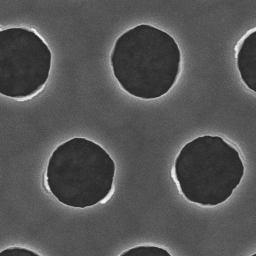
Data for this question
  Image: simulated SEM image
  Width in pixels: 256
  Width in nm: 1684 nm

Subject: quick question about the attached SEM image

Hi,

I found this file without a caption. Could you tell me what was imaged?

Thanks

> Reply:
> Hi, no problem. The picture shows holes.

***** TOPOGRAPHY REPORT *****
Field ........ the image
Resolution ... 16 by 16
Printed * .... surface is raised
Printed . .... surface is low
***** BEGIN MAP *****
****************
****************
...****....****.
...****....****.
...****....****.
..******...*****
****************
****************
****************
***....****....*
***....****....*
***....****....*
****..******..**
****************
****************
********..******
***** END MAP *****